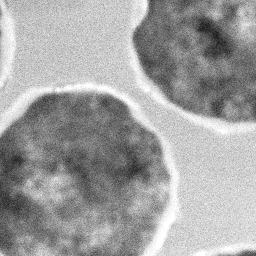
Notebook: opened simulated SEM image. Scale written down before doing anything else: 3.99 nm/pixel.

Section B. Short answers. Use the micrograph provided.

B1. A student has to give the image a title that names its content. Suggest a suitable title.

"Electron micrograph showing holes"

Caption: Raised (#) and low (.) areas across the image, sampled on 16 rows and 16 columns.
#########.......
#########.......
########........
#########.......
#########.......
#########.......
#.......###.....
.........####...
..........######
..........######
...........#####
...........#####
...........#####
..........######
..........######
.........######.